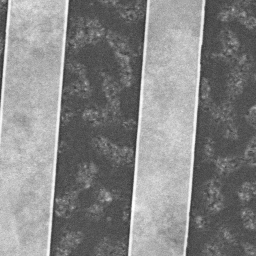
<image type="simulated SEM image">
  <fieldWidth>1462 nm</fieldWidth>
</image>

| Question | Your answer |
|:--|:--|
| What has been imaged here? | one or a few lines or trenches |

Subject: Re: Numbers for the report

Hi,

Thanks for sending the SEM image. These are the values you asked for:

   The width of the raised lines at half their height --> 322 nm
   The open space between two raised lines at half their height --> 460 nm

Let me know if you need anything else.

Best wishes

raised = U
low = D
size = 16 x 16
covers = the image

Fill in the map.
DUUUDDDDDUUUUDDD
UUUUDDDDDUUUUDDD
UUUUDDDDDUUUUDDD
UUUUDDDDDUUUDDDD
UUUUDDDDDUUUDDDD
UUUUDDDDDUUUDDDD
UUUUDDDDDUUUDDDD
UUUUDDDDDUUUDDDD
UUUUDDDDDUUUDDDD
UUUUDDDDDUUUDDDD
UUUDDDDDUUUUDDDD
UUUDDDDDUUUUDDDD
UUUDDDDDUUUUDDDD
UUUDDDDDUUUUDDDD
UUUDDDDDUUUUDDDD
UUUDDDDDUUUUDDDD